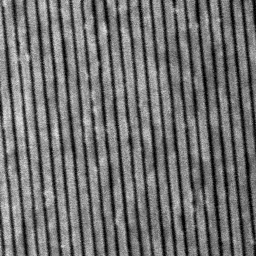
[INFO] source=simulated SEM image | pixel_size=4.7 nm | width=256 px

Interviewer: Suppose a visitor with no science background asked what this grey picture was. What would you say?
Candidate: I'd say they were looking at parallel lines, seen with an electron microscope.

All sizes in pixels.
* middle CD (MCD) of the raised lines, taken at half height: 8.09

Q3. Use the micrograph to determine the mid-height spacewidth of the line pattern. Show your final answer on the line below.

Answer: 0.0169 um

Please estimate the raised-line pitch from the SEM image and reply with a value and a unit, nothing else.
53.5 nanometers